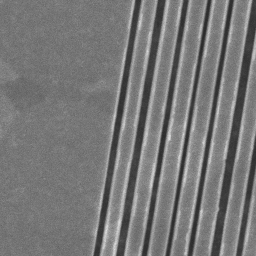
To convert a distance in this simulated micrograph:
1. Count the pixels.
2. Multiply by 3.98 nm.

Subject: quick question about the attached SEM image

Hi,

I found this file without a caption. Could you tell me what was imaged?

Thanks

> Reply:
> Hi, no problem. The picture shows parallel lines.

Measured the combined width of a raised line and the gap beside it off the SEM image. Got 0.0928 microns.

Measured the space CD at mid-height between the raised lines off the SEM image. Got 0.0274 microns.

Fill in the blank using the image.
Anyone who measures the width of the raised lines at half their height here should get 65.2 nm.